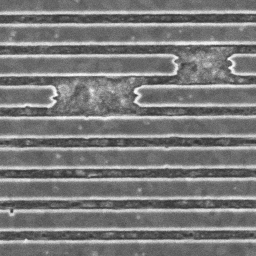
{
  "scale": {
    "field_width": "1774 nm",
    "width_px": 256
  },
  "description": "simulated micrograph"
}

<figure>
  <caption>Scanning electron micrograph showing parallel lines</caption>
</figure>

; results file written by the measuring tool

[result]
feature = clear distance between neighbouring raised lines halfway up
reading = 81.4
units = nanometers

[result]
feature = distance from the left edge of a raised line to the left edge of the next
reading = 214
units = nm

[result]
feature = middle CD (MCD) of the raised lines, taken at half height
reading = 133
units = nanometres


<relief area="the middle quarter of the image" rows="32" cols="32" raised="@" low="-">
@@@@@@@@@@@@@@@@@@@@@@@@@@@@----
@@@@@@@@@@@@@@@@@@@@@@@@@@@@----
@@@@@@@@@@@@@@@@@@@@@@@@@@@-----
--------------------------------
--------------------------------
--------------------@--@@@@@-@--
------------------@@@@@@@@@@@@@@
------------------@@@@@@@@@@@@@@
------------------@@@@@@@@@@@@@@
------------------@@@@@@@@@@@@@@
--------------------------------
--------------------------------
--------------------------------
@@@@@@@@@@@@@@@@@@@@@@@@@@@@@@@@
@@@@@@@@@@@@@@@@@@@@@@@@@@@@@@@@
@@@@@@@@@@@@@@@@@@@@@@@@@@@@@@@@
@@@@@@@@@@@@@@@@@@@@@@@@@@@@@@@@
@@@@@@@@@@@@@@@@@@@@@@@@@@@@@@@@
--------------------------------
--------------------------------
--------------------------------
@@@@@@@@@@@@@@@@@@@@@@@@@@@@@@@@
@@@@@@@@@@@@@@@@@@@@@@@@@@@@@@@@
@@@@@@@@@@@@@@@@@@@@@@@@@@@@@@@@
@@@@@@@@@@@@@@@@@@@@@@@@@@@@@@@@
@@@@@@@@@@@@@@@@@@@@@@@@@@@@@@@@
--------------------------------
----@---------------------------
--------------------------------
@@@@@@@@@@@@@@@@@@@@@@@@@@@@@@@@
@@@@@@@@@@@@@@@@@@@@@@@@@@@@@@@@
@@@@@@@@@@@@@@@@@@@@@@@@@@@@@@@@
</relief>